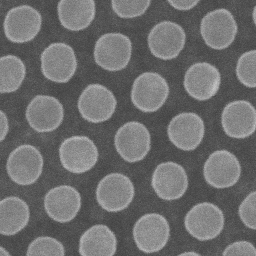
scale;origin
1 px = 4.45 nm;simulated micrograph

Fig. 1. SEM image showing a regular array of raised bodies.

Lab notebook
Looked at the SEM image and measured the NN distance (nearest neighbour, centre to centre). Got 52.7 pixels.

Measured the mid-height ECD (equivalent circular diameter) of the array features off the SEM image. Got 0.165 um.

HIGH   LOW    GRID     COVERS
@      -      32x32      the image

-------@@@@@--@@@@@--@@@--------
-@@@@--@@@@@--@@@@--------@@@---
-@@@@---@@@--------------@@@@---
-@@@@---@@@--------@@@@--@@@@@--
-@@@---------@@@---@@@@--@@@@---
-------@----@@@@---@@@@---@@@---
-----@@@@---@@@@---@@@---------@
@@---@@@@---@@@@--------------@@
@@@--@@@@----@@---------@@@---@@
@@@---@@@---------@@---@@@@---@@
@@@--------------@@@@--@@@@----@
@---------@@@@---@@@@--@@@@-----
----@@@---@@@@---@@@@-----------
---@@@@@--@@@@---@@@--------@@@@
@--@@@@@--@@@@--------@@@---@@@@
@---@@@---------@@---@@@@---@@@@
@--------------@@@@--@@@@---@@@-
--------@@@---@@@@@--@@@@-------
--@@----@@@@---@@@@---@@--------
-@@@@--@@@@@---@@@--------@@@---
-@@@@---@@@@--------@@----@@@@--
-@@@@----@---------@@@@---@@@@--
--@@---------@@@---@@@@---@@@@--
-------@@---@@@@@--@@@@---------
------@@@@--@@@@@---@@@--------@
@@@---@@@@--@@@@---------@----@@
@@@@--@@@@--------------@@@@--@@
@@@----@@--------@@@@--@@@@@--@@
@@@--------@@----@@@@--@@@@@---@
----------@@@@---@@@@---@@@-----
----@@@@--@@@@---@@@@--------@@-
@--@@@@@--@@@@----@---------@@@@